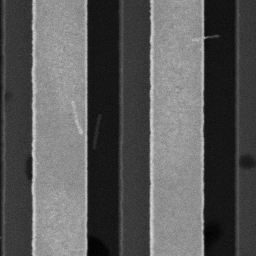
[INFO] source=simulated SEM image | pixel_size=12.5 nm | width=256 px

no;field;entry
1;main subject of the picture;lines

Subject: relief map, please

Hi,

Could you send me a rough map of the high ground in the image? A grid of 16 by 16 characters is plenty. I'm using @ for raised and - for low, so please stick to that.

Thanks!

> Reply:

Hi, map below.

@@@@@---@@@@@--@
@@@@@---@@@@@--@
@@@@@---@@@@@--@
@@@@@---@@@@@--@
@@@@@---@@@@@--@
@@@@@---@@@@@--@
@@@@@---@@@@@--@
@@@@@---@@@@@--@
@@@@@---@@@@@--@
@@@@@---@@@@@--@
@@@@@---@@@@@--@
@@@@@---@@@@@--@
@@@@@---@@@@@--@
@@@@@---@@@@@--@
@@@@@---@@@@@--@
@@@@@---@@@@@--@